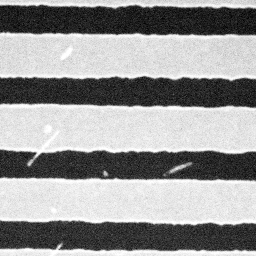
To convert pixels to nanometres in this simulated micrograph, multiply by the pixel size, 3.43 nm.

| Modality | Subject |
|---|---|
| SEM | lines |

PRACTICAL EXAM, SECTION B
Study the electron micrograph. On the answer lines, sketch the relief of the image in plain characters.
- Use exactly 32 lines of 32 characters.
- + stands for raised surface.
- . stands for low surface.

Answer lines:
++++++++++++++++++++++++++++++++
................................
................................
................................
++++++++++++++++++++.++.+...++..
++++++++++++++++++++++++++++++++
++++++++++++++++++++++++++++++++
++++++++++++++++++++++++++++++++
++++++++++++++++++++++++++++++++
++++++++++++++++++++++++++++++++
................................
................................
................................
++++++++++++++++++++++++++.++++.
++++++++++++++++++++++++++++++++
++++++++++++++++++++++++++++++++
++++++++++++++++++++++++++++++++
++++++++++++++++++++++++++++++++
++++++++++++++++++++++++++++++++
................................
................................
................................
++++++++...++...................
++++++++++++++++++++++++++++++++
++++++++++++++++++++++++++++++++
++++++++++++++++++++++++++++++++
++++++++++++++++++++++++++++++++
++++++++++++++++++++++++++++++++
................................
................................
................................
++++++++++++++++++++++++++++++++